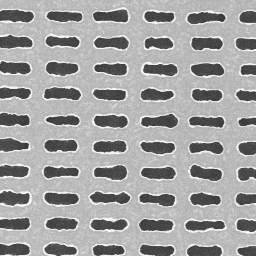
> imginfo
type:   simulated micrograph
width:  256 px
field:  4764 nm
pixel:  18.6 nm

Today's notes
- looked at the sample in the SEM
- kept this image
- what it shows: a regular array of holes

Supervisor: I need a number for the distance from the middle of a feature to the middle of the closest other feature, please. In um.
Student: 0.478